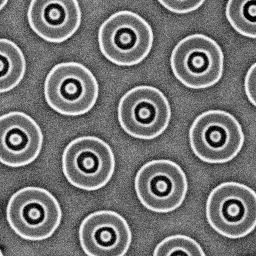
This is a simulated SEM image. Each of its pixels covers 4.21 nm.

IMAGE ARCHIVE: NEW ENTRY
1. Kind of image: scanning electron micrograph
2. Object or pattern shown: a regular array of ring-shaped raised bodies with a dot in the middle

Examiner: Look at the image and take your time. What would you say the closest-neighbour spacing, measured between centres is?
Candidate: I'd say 312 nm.